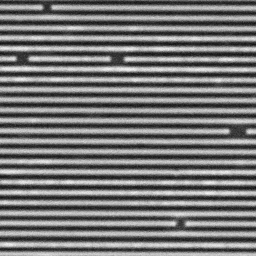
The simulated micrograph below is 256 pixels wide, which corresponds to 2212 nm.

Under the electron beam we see parallel lines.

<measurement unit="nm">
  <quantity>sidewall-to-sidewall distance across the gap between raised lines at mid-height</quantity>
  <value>51.8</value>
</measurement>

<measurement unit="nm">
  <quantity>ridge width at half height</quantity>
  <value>36.7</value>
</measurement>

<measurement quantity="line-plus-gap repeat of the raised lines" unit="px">10.3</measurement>